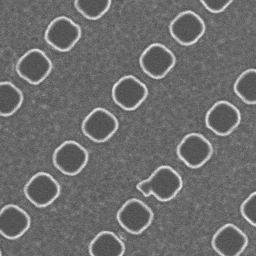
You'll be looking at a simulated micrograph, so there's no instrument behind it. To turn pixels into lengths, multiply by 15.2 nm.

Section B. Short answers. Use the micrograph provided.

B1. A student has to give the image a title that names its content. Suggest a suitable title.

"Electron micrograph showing a regular array of raised bodies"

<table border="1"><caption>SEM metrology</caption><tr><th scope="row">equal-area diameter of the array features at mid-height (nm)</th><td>497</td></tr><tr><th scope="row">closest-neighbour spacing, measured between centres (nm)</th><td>649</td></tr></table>